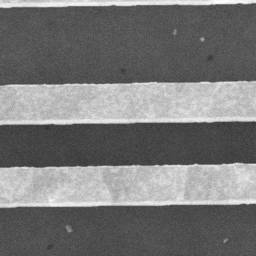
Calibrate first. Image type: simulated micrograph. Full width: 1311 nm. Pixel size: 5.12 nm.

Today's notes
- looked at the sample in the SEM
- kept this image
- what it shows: lines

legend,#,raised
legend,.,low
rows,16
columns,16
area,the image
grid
................
................
................
................
................
################
################
################
................
................
################
################
################
................
................
................